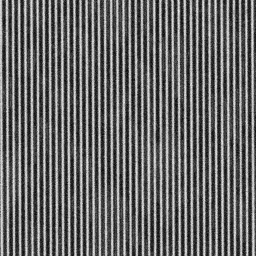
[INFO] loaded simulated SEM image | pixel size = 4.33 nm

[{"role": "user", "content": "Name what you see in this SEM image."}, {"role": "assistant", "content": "parallel lines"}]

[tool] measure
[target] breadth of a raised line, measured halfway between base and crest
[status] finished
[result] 0.007 microns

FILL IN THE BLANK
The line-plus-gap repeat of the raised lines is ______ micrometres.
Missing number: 0.0266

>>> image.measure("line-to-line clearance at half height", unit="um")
0.0179